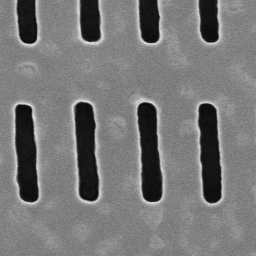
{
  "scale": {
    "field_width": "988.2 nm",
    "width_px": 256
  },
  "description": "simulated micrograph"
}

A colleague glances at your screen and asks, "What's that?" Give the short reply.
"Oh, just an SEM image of holes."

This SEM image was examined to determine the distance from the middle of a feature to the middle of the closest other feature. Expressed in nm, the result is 233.